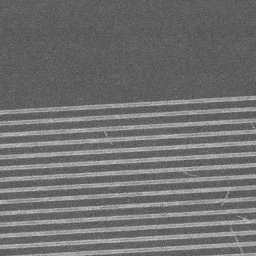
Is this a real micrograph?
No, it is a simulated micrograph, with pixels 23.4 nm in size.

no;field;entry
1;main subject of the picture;parallel lines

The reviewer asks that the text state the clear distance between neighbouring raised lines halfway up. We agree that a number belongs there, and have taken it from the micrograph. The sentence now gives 199 nm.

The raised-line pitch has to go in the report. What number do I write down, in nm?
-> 262